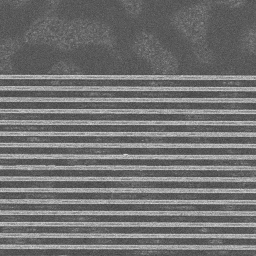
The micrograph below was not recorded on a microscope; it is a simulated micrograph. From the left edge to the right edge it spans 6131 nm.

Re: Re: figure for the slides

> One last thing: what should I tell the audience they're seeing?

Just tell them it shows parallel lines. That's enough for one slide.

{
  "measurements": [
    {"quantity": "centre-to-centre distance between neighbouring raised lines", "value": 271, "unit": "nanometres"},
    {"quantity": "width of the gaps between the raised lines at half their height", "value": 192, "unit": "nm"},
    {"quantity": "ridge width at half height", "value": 0.0629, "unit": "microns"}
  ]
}